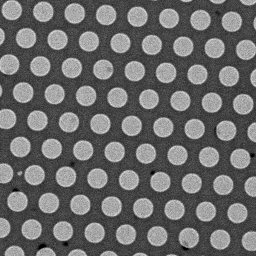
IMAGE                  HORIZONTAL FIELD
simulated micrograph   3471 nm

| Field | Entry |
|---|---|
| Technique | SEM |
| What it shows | an array of small figures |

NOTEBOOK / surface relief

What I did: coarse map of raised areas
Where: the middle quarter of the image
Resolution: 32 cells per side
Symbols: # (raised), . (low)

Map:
####....####....####....###.....
####...#####...#####...#####...#
####....####...#####...#####...#
.........##.....###....#####...#
.........................#......
................................
....###.....###......#..........
...#####...#####...####....####.
...#####...#####...#####...####.
....###....####....####....####.
............##......###....####.
............................##..
##..............................
###....####.....##..............
####...####....####....####....#
###....####....####....####...##
###....####....####....####...##
................##.....####....#
................................
....##..........................
...####....####....###..........
..#####...#####...#####...####..
...####...#####...#####...#####.
...###.....####...#####...#####.
...................###.....###..
................................
##.....##.......................
###...####....####.....##.......
###...#####...#####...####....##
###...#####...#####...####....##
#......###....####....####....##
.......................##.....##